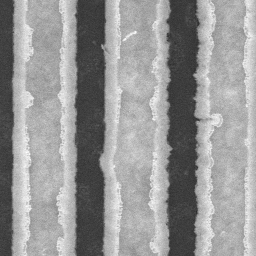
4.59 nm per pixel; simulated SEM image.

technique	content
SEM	one or a few lines or trenches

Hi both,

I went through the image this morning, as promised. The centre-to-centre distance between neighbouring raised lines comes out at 422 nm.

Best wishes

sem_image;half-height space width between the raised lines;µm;0.191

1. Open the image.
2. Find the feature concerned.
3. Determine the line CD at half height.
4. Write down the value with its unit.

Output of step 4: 231 nanometres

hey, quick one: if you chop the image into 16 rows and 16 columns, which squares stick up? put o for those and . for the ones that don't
.ooo...ooo...ooo
.ooo...ooo...ooo
.ooo...ooo...ooo
.ooo...ooo...ooo
.ooo...ooo...ooo
.ooo...ooo...ooo
.ooo...ooo...ooo
.ooo...ooo...ooo
.ooo...ooo...ooo
.ooo...ooo...ooo
.ooo...ooo...ooo
.ooo...ooo...ooo
.ooo...ooo...ooo
.ooo...ooo...ooo
.ooo...ooo...ooo
.ooo...ooo...ooo